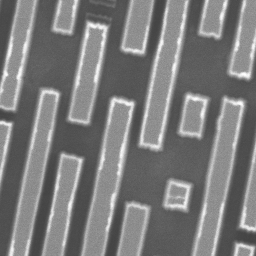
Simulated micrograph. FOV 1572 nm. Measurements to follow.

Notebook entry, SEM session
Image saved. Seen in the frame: parallel lines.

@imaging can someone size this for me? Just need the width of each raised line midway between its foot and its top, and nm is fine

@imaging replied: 144